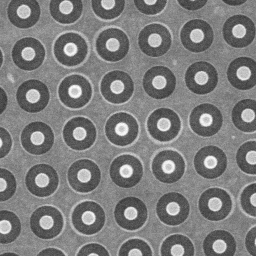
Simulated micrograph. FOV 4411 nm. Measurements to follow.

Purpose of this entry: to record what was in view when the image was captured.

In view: an array of small figures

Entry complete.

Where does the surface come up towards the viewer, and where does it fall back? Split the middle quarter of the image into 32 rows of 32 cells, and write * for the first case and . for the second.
....*******************..******.
*************.*******......****.
**..******......****.......***..
......****.......***...**...**..
.......**...**...***..***...**..
.......**...***...**...**...***.
..**...**...***..***........***.
..**...**........****......*****
.......***.......*****...*******
......*****.....****************
.....***************************
***********************....*****
************.....****........**.
**....*****.......***........**.
.......***.........*....**...**.
........**...**....*....**....*.
...**...**...***...**...**...***
..***...**....*....**........***
...**...***.......****......****
........***.......*****....*****
*......******...****************
**....******************....****
**************...******......***
*************......***........**
**......****.......***........**
**.......**.........**...**....*
*...**...**...***...**...**...**
*...**...**...**....**........**
*...***..***........***......***
*........***.......*****....****
*.......*****.....**************
**......************************